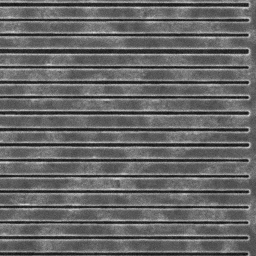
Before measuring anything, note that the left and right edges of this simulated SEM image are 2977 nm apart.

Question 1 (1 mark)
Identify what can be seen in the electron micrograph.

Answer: parallel lines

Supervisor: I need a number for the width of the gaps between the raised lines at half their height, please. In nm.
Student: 37.8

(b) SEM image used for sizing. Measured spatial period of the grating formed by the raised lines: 0.181 microns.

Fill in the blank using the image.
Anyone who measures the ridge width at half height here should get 141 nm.